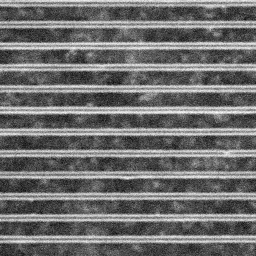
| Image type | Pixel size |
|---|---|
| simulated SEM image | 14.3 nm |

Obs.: parallel lines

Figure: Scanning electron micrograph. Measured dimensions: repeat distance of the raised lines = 307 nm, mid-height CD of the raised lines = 0.0733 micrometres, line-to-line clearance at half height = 234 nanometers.